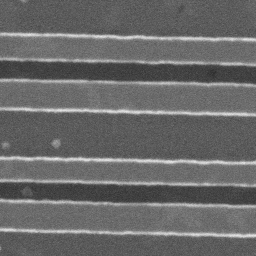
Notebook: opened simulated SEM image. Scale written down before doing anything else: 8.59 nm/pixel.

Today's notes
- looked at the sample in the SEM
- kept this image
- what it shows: lines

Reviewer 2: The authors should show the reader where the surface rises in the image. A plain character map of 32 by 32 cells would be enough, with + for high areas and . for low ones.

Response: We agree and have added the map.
................................
................................
................................
................................
+++++++++.......................
++++++++++++++++++++++++++++++++
++++++++++++++++++++++++++++++++
.....+++++++++++++++++++++++++++
................................
................................
+++++++++++++++++++++++++.......
++++++++++++++++++++++++++++++++
++++++++++++++++++++++++++++++++
++++++++++++++++++++++++++++++++
................................
................................
................................
................................
................................
................................
++++++++++++++++++++++++++++++++
++++++++++++++++++++++++++++++++
++++++++++++++++++++++++++++++++
................................
................................
++++++++++++++++++++............
++++++++++++++++++++++++++++++++
++++++++++++++++++++++++++++++++
++++++++++++++++++++++++++++++++
................................
................................
................................